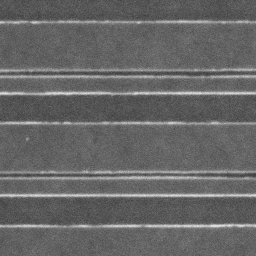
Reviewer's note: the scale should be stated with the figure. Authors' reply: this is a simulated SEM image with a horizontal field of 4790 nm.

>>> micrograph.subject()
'lines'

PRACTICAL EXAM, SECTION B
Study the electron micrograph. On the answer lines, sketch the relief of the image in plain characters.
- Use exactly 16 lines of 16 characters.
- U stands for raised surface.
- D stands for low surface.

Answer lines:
DDDDDDDDDDDDDDDD
UUUUUUUUUUUUUUUU
UUUUUUUUUUUUUUUU
UUUUUUUUUUUUUUUU
UUUUUUUUUUUUUUUU
UUUUUUUUUUUUUUUU
DDDDDDDDDDDDDDDD
DDDDDDDDDDDDDDDD
UUUUUUUUUUUUUUUU
UUUUUUUUUUUUUUUU
UUUUUUUUUUUUUUUU
UUUUUUUUUUUUUUUU
DDDDDDDDDDDDDDDD
DDDDDDDDDDDDDDDD
UUUUUUUUUUUUUUUU
UUUUUUUUUUUUUUUU